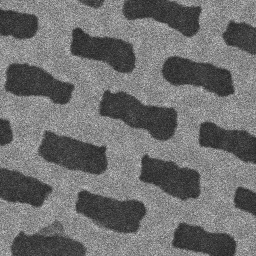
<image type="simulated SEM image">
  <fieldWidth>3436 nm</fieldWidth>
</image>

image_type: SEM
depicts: holes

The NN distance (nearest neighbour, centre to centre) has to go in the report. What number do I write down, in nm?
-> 945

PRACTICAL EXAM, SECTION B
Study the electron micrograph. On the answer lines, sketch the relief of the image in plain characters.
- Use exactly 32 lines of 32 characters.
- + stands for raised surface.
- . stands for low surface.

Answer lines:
++++++++++...++.......++++++++++
..+++++++++++++..........+++++++
.....+++++++++++.++......+++++++
.....++++++++++++++++....+++....
....+++++..++++++++++++.++++....
+++++++++.......++++++++++++....
+++++++++........++++++++++++++.
++++++++++++.....++++...++++++++
+....+++++++++...+++........++++
+......+++++++++++++.........+++
+........++++++++++++........+++
+........++++.++++++++++++...+++
++++++...++++....+++++++++++++++
++++++++++++..........++++++++++
+++++++++++++.........++++++++++
.+++++++++++++++......+++..+++++
..++++.++++++++++++...+++......+
.++++.....++++++++++.++++.......
+++++........+++++++++++++......
+++++........+++++.++++++++++...
+++++++......+++++....++++++++++
..++++++++...+++++.......+++++++
.....+++++++++++++.......+++++++
......++++++++++++++.....+++++.+
......++++...++++++++....++++...
++++.++++.........+++++++++++...
++++++++++........+++++++++++++.
+++++++++++.......++++++++++++++
+++++...+++++....+++++...+++++++
++.......+++++++++++++.......+++
+.........++++++++++++.......+++
+..........++++++++++++++....+++